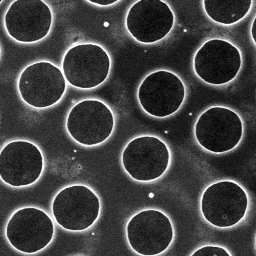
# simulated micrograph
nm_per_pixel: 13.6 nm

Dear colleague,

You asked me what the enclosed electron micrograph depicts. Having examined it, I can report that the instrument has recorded a regular array of holes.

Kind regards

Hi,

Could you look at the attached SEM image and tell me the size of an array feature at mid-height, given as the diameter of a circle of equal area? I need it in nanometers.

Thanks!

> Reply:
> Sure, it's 618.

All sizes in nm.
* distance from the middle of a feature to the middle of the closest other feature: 820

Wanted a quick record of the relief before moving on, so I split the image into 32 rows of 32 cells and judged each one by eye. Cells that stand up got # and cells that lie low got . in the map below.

##....######..###....#####.....#
#.....##########.....#####.....#
#.....##########......#####...##
#.....##########.....##########.
#.....###########....###########
##########################...###
########.....############.....##
########......##########......##
###....#......##########......##
###..........######...###....###
##......#...######.....#########
###.....#########......#########
###....##########......#########
#########....#####....#####.####
#########.....######.####.....##
########......###########.....##
#########.....##########......##
#########....####...#####.....##
#....###########.....#####...###
.....##########......###########
.....##########......###########
.....###########....############
....#############..#############
########...###############....##
#######.....#############......#
#######.....#############......#
##...##.....######..#####......#
#.....#.....####.....#####....##
#......#...#####......##########
#......#########......##########
#.....##########.....###########
###.#############...####....####